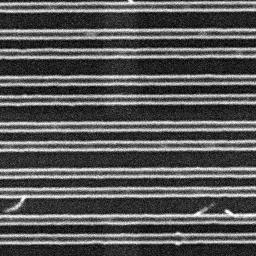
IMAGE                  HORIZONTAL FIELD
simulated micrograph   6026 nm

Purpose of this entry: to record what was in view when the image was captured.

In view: parallel lines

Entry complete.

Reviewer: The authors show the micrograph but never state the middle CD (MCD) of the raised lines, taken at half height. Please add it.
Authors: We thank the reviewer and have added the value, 206 nanometres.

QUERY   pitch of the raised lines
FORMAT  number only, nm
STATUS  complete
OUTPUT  546